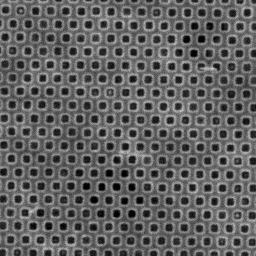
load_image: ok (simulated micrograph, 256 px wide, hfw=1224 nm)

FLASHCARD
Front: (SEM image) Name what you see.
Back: a regular array of holes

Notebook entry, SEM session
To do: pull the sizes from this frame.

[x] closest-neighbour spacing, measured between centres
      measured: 14.9 px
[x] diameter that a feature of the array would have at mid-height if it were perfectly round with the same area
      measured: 43.2 nm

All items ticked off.